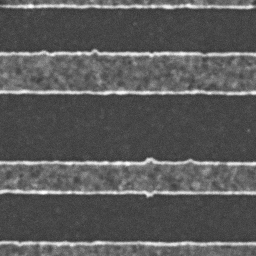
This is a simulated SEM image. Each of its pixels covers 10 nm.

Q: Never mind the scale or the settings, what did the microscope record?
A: one or a few lines or trenches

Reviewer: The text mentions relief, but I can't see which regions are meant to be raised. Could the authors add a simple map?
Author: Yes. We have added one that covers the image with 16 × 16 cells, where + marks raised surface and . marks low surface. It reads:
................
................
................
++++++++++++++++
++++++++++++++++
++++++++++++++++
................
................
................
................
++++++++++++++++
++++++++++++++++
................
................
................
++++++++++++++++